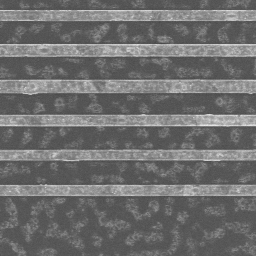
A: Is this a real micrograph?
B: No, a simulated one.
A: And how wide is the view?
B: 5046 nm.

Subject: parallel lines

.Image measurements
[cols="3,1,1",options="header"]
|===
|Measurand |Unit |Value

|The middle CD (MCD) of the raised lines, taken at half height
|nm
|214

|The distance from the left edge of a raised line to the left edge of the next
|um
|0.69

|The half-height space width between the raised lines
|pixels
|23.8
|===